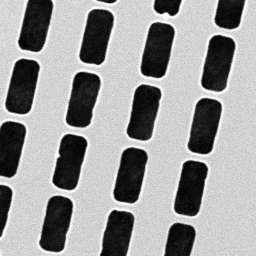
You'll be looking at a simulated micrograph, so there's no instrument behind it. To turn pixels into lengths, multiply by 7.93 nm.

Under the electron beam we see a regular array of holes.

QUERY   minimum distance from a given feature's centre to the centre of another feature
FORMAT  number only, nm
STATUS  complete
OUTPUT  492